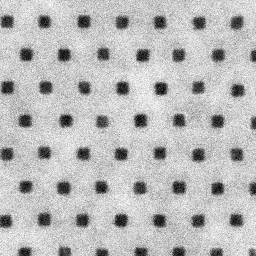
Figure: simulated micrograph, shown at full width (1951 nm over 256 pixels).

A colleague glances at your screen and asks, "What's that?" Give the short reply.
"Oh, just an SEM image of a regular array of raised bodies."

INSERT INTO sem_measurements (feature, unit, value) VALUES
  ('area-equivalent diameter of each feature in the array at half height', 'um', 0.132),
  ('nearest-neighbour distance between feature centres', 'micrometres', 0.285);